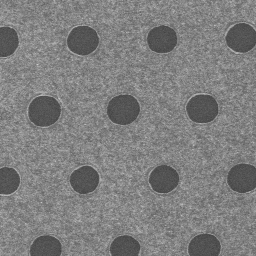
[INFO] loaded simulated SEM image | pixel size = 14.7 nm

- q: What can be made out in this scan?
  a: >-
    holes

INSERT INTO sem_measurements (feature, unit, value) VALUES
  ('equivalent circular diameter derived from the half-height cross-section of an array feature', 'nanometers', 461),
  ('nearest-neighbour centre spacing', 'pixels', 79.1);